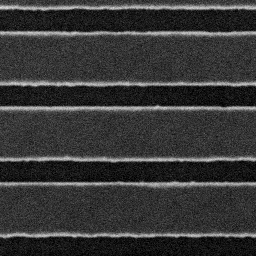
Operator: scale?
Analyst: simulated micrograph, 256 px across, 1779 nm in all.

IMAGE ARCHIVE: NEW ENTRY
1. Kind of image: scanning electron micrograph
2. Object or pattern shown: lines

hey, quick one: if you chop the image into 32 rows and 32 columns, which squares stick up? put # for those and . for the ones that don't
################################
................................
................................
................................
################################
################################
################################
################################
################################
################################
################################
................................
................................
################################
################################
################################
################################
################################
################################
################################
................................
................................
................................
################################
################################
################################
################################
################################
################################
#..###.....#..#.####....#......#
................................
................................